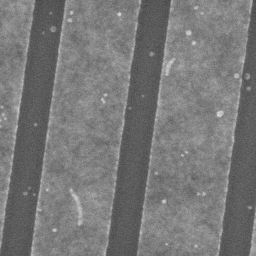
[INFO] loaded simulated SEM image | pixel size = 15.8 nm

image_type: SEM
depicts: lines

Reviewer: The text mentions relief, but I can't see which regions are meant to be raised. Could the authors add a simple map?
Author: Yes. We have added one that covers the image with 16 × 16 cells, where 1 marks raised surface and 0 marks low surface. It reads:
1100111110011111
1100111110011111
1100111100111110
1100111100111110
1101111100111110
1001111100111110
1001111100111110
1001111100111110
1001111100111110
1001111001111100
1001111001111100
1001111001111100
0011111001111100
0011111001111100
0011111001111100
0011111001111100